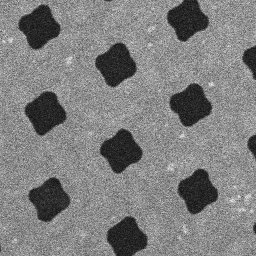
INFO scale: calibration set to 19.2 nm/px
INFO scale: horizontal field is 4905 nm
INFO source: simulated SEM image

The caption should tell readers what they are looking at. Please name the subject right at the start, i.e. holes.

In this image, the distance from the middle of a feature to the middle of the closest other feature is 1630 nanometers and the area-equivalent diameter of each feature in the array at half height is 752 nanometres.